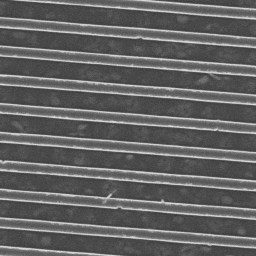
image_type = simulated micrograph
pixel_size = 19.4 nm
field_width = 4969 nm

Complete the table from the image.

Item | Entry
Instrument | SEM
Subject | parallel lines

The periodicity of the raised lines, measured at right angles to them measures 554 nanometers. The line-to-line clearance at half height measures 0.36 microns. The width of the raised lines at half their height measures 0.189 µm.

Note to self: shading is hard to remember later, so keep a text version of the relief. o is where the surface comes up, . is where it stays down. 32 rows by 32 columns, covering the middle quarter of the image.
.................ooooooooooooooo
.............................ooo
................................
................................
oooooo..........................
ooooooooooooooooooo.............
...oooooooooooooooooooooooooooo.
...............ooooooooooooooooo
............................oooo
................................
................................
ooooo...........................
ooooooooooooooooo...............
ooooooooooooooooooooooooooo.....
...........ooooooooooooooooooooo
........................oo.ooooo
................................
................................
o...............................
ooooooooooooooo.................
oooooooooooooooooooooooooo......
..........oooooooooooooooooooooo
......................oooooooooo
................................
................................
................................
oooooooooooo....................
oooooooooooooooooooooooo........
.........ooooooooooooooooooooooo
.....................ooooooooooo
................................
................................